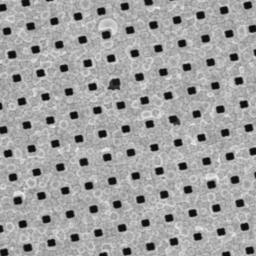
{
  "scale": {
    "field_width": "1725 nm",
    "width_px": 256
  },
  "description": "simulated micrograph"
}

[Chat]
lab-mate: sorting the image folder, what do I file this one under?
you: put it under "a regular array of holes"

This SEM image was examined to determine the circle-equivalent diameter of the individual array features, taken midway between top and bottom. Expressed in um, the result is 0.0569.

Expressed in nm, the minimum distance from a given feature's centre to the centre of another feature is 161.